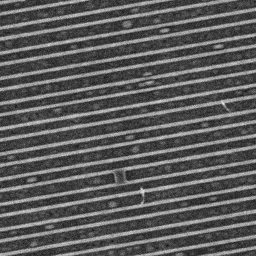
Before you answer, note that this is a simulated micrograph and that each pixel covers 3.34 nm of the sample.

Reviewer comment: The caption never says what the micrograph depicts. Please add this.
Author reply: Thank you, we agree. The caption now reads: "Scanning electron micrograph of parallel lines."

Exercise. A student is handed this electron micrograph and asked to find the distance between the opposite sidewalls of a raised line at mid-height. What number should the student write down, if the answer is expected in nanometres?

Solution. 10.3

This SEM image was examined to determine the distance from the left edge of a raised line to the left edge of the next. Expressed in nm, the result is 41.6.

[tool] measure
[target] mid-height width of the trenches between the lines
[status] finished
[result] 28 nm